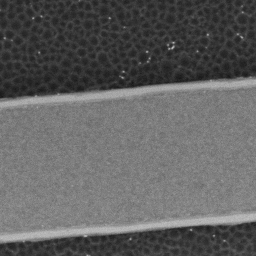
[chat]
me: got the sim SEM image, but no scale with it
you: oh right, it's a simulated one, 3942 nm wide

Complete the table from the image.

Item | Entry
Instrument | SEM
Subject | one or a few lines or trenches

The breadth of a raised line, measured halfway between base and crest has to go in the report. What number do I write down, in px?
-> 134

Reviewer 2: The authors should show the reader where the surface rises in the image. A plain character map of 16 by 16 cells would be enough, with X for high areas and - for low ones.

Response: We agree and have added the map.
----------------
----------------
----------------
----------------
----------------
-----------XXXXX
XXXXXXXXXXXXXXXX
XXXXXXXXXXXXXXXX
XXXXXXXXXXXXXXXX
XXXXXXXXXXXXXXXX
XXXXXXXXXXXXXXXX
XXXXXXXXXXXXXXXX
XXXXXXXXXXXXXXXX
XXXXXXXXXXXXXXXX
XXXX------------
----------------